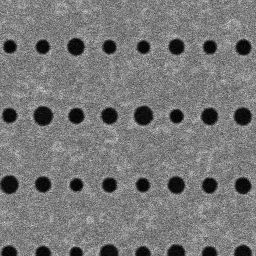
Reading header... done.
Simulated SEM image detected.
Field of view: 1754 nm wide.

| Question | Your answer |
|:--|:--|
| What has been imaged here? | a regular array of holes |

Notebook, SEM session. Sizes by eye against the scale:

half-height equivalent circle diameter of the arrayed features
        109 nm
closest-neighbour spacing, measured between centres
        226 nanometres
